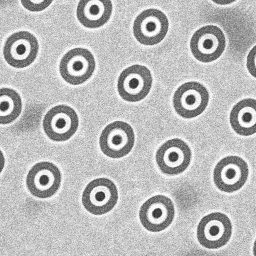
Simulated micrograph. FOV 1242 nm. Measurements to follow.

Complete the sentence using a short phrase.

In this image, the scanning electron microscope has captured a regular array of ring-shaped grooves with a dot in the middle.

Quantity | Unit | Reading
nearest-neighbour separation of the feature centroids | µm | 0.284